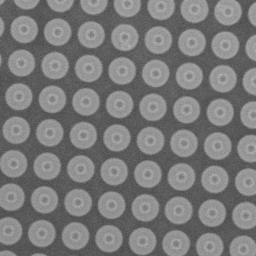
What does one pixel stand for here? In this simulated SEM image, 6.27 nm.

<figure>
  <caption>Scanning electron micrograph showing an array of small figures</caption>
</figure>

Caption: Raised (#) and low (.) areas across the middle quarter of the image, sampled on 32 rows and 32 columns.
#..######..#######..######...###
#..######..#######..######..####
...######..#######..######..####
....#####...#####...######..####
.............###....#####...####
......................##.....###
....###.........................
...#####....####................
..#######..######...#####....###
..#######..######..######...####
..#######..######..#######..####
...#####...######..######..#####
....###.....####...######...####
....................####....####
.............................###
...####.....###.................
..######...#####...#####........
..######..######...######...####
..######..######..#######..#####
..######..######..#######..#####
...####....#####...######..#####
............###....#####...#####
............................####
..####..........................
.######...#####.....##..........
.######...######..######...####.
.######..#######..######..######
.######..#######..######..######
..#####...#####...######..######
....#.....#####...######..######
...................####....#####
..###........................#..